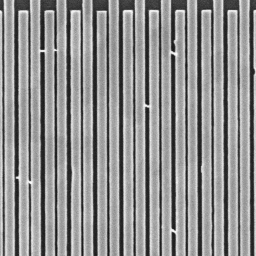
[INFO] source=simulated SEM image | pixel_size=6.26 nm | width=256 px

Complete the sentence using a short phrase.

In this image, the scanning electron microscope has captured parallel lines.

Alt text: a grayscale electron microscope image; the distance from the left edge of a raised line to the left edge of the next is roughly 0.0818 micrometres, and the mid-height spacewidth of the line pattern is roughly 26.2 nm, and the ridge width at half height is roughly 57.9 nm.